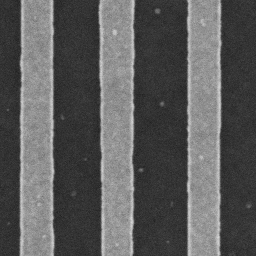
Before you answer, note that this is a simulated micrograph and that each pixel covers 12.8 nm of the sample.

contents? lines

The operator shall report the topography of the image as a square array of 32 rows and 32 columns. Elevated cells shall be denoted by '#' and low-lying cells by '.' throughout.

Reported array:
...####......####.......###.....
...####......####.......###.....
...####......####.......###.....
...####......####.......###.....
...####......####.......###.....
...####......####.......###.....
...####......####.......###.....
...####......####.......###.....
...####......####.......###.....
...####......####.......###.....
...####......####.......###.....
...####......####.......###.....
...####......####.......###.....
...####......####.......###.....
...####......####.......###.....
...####......####.......###.....
...####......####.......###.....
...####......####.......###.....
...####......####.......###.....
...####......###........###.....
...####......####.......###.....
...####......####.......###.....
...####......####.......###.....
...####......####.......###.....
...####......####.......###.....
...####......####.......###.....
...####......####.......###.....
...####......####.......###.....
...####......####.......###.....
...####......###........###.....
...####......###........###.....
...####......###........###.....